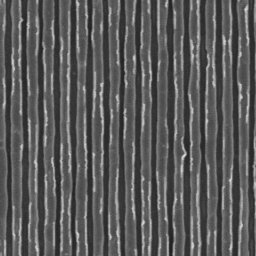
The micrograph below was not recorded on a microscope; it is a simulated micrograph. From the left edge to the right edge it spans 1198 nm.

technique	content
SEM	parallel lines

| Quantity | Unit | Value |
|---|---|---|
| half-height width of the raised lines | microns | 0.0445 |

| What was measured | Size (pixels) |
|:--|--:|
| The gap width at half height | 6.13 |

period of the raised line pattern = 0.0758 micrometres